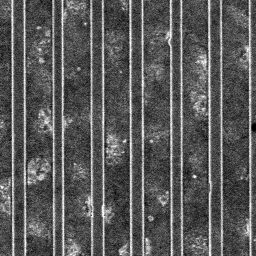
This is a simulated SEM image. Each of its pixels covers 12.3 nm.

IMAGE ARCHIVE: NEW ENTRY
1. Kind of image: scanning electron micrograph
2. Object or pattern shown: parallel lines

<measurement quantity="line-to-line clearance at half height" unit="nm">342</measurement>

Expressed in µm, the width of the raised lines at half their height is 0.16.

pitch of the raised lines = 484 nm